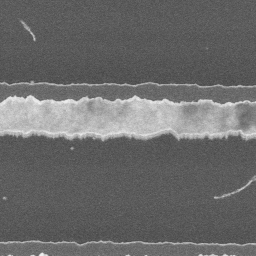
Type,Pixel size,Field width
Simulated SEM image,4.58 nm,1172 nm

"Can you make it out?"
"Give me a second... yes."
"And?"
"lines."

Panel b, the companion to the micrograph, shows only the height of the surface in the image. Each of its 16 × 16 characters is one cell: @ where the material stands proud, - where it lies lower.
----------------
----------------
----------------
----------------
----------------
@@@@@@@@@@@@@@@@
@@@@@@@@@@@@@@@@
@@@@@@@@@@@@@@@@
----------------
----------------
----------------
----------------
----------------
----------------
----------------
@@@@@@@@@@@@@@@@